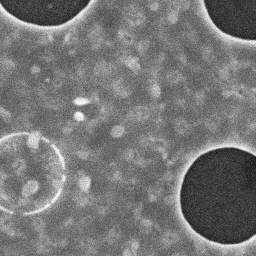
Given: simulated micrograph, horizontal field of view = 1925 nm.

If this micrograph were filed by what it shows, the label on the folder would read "holes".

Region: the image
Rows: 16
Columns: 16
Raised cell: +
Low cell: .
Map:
.....++++++++...
++..+++++++++...
+++++++++++++++.
++++++++++++++++
++++++++++++++++
++++++++++++++++
++++++++++++++++
++++++++++++++++
++++++++++++++++
+++++++++++++..+
++++++++++++....
+++++++++++.....
+++++++++++.....
+++++++++++.....
++++++++++++....
++++++++++++++++